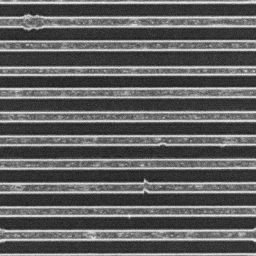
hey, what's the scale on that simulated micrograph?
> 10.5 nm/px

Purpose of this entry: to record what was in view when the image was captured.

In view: parallel lines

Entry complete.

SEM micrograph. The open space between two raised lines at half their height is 149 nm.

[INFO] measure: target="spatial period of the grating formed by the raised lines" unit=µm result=0.248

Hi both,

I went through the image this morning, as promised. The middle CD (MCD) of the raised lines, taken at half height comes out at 8.87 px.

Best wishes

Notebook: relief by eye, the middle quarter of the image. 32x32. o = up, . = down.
................................
oooooooooooooooooooooooooooooooo
oooooooooooooooooooooooooooooooo
................................
................................
................................
oooooooooooooooooooooooooooooooo
oooooooooooooooooooooooooooooooo
................................
................................
................................
................................
oooooooooooooooooooooooooooooooo
oooooooooooooooooooooooooooooooo
................................
................................
................................
................................
oooooooooooooooooooooooooooooooo
oooooooooooooooooooooooooooooooo
................................
................................
................................
................................
oooooooooooooooooooooooooooooooo
oooooooooooooooooooooooooooooooo
................................
................................
................................
................................
oooooooooooooooooooooooooooooooo
oooooooooooooooooooooooooooooooo